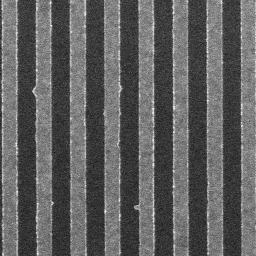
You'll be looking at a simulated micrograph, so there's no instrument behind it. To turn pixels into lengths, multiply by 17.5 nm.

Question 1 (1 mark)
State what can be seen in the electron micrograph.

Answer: parallel lines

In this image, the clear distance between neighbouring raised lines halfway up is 0.34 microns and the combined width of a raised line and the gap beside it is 599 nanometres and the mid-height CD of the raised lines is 256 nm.